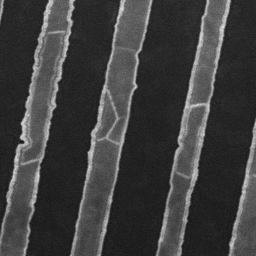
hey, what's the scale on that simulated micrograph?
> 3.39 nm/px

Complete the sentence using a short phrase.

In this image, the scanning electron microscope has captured one or a few lines or trenches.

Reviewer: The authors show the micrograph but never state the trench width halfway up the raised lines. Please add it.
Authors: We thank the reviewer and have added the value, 163 nm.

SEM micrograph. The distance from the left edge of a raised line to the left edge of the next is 264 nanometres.